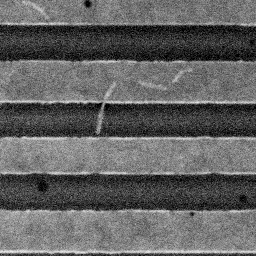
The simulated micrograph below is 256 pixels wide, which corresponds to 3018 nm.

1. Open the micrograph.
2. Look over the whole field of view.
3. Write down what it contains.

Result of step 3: lines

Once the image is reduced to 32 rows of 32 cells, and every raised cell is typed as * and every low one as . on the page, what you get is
********************************
********************************
********************************
................................
................................
................................
................................
................................
********************************
********************************
********************************
********************************
********************************
................................
................................
................................
................................
********************************
********************************
********************************
********************************
********************************
................................
................................
................................
................................
********************************
********************************
********************************
********************************
********************************
.........*...**.................